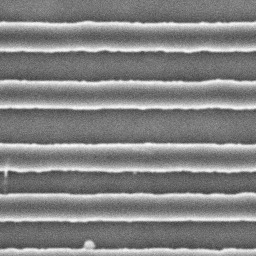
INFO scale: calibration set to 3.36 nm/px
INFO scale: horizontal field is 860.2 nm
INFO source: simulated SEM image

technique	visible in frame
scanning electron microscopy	lines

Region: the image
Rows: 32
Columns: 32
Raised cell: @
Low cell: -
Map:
--------------------------------
--------------------------------
--------------------------------
@@@@@@@@@@@@@@@@@@@@@@@@@@@@@@@@
@@@@@@@@@@@@@@@@@@@@@@@@@@@@@@@@
@@@@@@@@@@@@@@@@@@@@@@@@@@@@@@@@
--------------------------------
--------------------------------
--------------------------------
--------------------------------
@@@@@@@@@@@@@@@@@@@@@@@@@@@@@@@@
@@@@@@@@@@@@@@@@@@@@@@@@@@@@@@@@
@@@@@@@@@@@@@@@@@@@@@@@@@@@@@@@@
---------@@@@----@@----------@@@
--------------------------------
--------------------------------
--------------------------------
--------------------------------
@@@@@@@@@@@@@@@@@@@@@@@@@@@@@@@@
@@@@@@@@@@@@@@@@@@@@@@@@@@@@@@@@
@@@@@@@@@@@@@@@@@@@@@@@@@@@@@@@@
--------------------------------
--------------------------------
--------------------------------
@@@@@@@@@@@@@@@@@@@@@@@@@@@@@@@@
@@@@@@@@@@@@@@@@@@@@@@@@@@@@@@@@
@@@@@@@@@@@@@@@@@@@@@@@@@@@@@@@@
@@@@@@@@@@@@@@@@@@@@@@@@@@@@@@@@
--------------------------------
--------------------------------
--------------------------------
@@@@@@@@@@@@@@@@@@@@@@@@@@@@@@@@